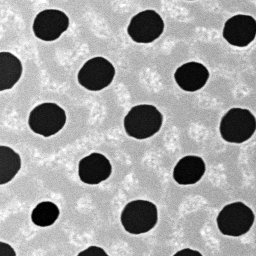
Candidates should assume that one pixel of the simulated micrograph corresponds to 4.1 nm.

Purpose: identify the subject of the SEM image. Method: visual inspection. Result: a regular array of holes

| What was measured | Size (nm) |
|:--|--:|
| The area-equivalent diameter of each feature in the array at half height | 139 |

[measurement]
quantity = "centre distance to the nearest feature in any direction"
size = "274 nm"